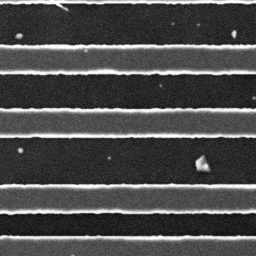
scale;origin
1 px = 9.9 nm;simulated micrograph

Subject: lines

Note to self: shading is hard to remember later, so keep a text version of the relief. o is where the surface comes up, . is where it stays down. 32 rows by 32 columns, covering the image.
................................
................................
................................
................................
................................
................................
oooooooooooooooooooooooooooooooo
oooooooooooooooooooooooooooooooo
oooooooooooooooooooooooooooooooo
................................
................................
................................
................................
................................
oooooooooooooooooooooooooooooooo
oooooooooooooooooooooooooooooooo
oooooooooooooooooooooooooooooooo
................................
................................
................................
................................
................................
................................
oooooooooooooooooooooooooooooooo
oooooooooooooooooooooooooooooooo
oooooooooooooooooooooooooooooooo
oooooooooooooooooooooooooooooooo
................................
................................
o...............................
oooooooooooooooooooooooooooooooo
oooooooooooooooooooooooooooooooo